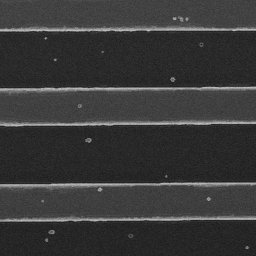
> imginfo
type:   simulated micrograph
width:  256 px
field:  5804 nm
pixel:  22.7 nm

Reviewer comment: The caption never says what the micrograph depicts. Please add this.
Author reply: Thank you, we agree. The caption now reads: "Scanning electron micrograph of lines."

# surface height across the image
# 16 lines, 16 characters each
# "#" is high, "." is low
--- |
################
################
................
................
................
...............#
################
################
................
................
................
...........#####
################
################
................
................